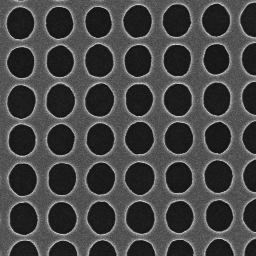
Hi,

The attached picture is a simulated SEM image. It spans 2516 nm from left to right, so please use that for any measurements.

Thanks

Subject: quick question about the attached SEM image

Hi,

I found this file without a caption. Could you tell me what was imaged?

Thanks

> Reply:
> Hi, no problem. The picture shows a regular array of holes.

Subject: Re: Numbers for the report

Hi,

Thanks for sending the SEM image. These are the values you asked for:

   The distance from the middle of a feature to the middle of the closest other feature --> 381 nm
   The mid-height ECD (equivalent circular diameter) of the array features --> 295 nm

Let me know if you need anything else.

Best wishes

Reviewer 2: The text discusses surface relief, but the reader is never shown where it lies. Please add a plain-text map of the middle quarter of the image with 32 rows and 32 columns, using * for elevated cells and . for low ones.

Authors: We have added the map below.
..***.......***.......***......*
..****......****.....*****.....*
.*****.....*****.....******...**
********************************
********************************
.******....******....******...**
..****......****......****.....*
..****......****......***.......
...**........**.......***.......
...**.......***.......***.......
...**.......****......***.......
..****......****.....*****.....*
.******....******...*******...**
********************************
*******************.************
.******....******....*****.....*
..****......****......****......
...***......****......***.......
...***.......**.......***.......
...***......***.......***.......
..****......****......***.......
..*****.....****.....*****.....*
.*******..********.*********..**
********************************
*********.******************.***
..*****....******....*****.....*
...***......****......****......
...***.......**........**.......
...**........**........**.......
...***.......**........***......
...***......****......****......
..****......*****....*****.....*